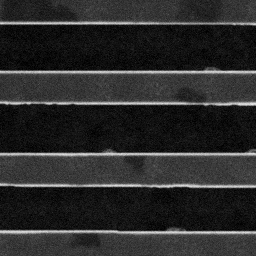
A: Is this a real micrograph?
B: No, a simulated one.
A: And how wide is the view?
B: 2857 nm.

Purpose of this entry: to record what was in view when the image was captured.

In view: lines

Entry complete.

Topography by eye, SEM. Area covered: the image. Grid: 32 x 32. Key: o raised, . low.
oooooooooooooooooooooooooooooooo
oooooooooooooooooooooooooooooooo
oooooooooooooooooooooooooooooooo
................................
................................
................................
................................
................................
................................
oooooooooooooooooooooooooooooooo
oooooooooooooooooooooooooooooooo
oooooooooooooooooooooooooooooooo
oooooooooooooooooooooooooooooooo
................................
................................
................................
................................
................................
................................
oooooooooooooooooooooooooooooooo
oooooooooooooooooooooooooooooooo
oooooooooooooooooooooooooooooooo
oooooooooooooooooooooooooooooooo
................................
................................
................................
................................
................................
................................
oooooooooooooooooooooooooooooooo
oooooooooooooooooooooooooooooooo
oooooooooooooooooooooooooooooooo